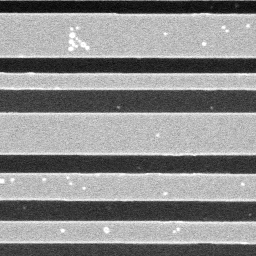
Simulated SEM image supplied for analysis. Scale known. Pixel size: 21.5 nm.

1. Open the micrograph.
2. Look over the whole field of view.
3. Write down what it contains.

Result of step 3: lines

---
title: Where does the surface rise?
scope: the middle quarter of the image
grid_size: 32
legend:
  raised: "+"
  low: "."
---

................................
................................
................................
++++++++++++++++++++++++++++++++
++++++++++++++++++++++++++++++++
++++++++++++++++++++++++++++++++
................................
................................
................................
................................
................................
................................
++++++++++++++++++++++++++++++++
++++++++++++++++++++++++++++++++
++++++++++++++++++++++++++++++++
++++++++++++++++++++++++++++++++
++++++++++++++++++++++++++++++++
++++++++++++++++++++++++++++++++
++++++++++++++++++++++++++++++++
++++++++++++++++++++++++++++++++
++++++++++++++++++++++++++++++++
++++++++++++++++++++++++++++++++
++++++++++++++++++++++++++++++++
................................
................................
................................
................................
+++++.+.++++++++....+++++....++.
++++++++++++++++++++++++++++++++
++++++++++++++++++++++++++++++++
++++++++++++++++++++++++++++++++
++++++++++++++++++++++++++++++++